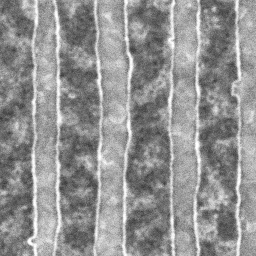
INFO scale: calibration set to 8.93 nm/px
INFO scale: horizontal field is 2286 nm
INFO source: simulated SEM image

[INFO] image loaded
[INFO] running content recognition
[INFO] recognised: one or a few lines or trenches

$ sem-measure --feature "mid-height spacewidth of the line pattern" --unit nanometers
218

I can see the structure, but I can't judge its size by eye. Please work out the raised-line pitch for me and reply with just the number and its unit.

614 nanometers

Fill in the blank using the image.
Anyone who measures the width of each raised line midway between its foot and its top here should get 372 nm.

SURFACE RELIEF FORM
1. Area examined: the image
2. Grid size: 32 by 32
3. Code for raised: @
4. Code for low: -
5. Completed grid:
@@@@@--@@@@@----@@@@@@---@@@@@--
@@@@@--@@@@@----@@@@@@---@@@@@--
@@@@@--@@@@@----@@@@@@---@@@@@--
@@@@---@@@@@----@@@@@@---@@@@@--
@@@@---@@@@@----@@@@@@---@@@@@--
@@@@---@@@@@----@@@@@@---@@@@@--
@@@@---@@@@@----@@@@@@---@@@@@--
@@@@---@@@@@----@@@@@@---@@@@@--
@@@@---@@@@@----@@@@@@---@@@@@--
@@@@---@@@@@@---@@@@@----@@@@@--
@@@@---@@@@@@---@@@@@@---@@@@---
@@@@---@@@@@@---@@@@@----@@@@---
@@@@---@@@@@@---@@@@@----@@@@@--
@@@@---@@@@@@---@@@@@----@@@@@--
@@@@---@@@@@@-@-@@@@@----@@@@@--
@@@@---@@@@@@---@@@@@----@@@@@--
@@@@---@@@@@@---@@@@@----@@@@@--
@@@@---@@@@@@---@@@@@----@@@@@--
@@@@---@@@@@@---@@@@@----@@@@@--
@@@@---@@@@@----@@@@@@---@@@@@--
@@@@---@@@@@----@@@@@----@@@@@--
@@@@---@@@@@----@@@@@@---@@@@@--
@@@@---@@@@@----@@@@@----@@@@@--
@@@@---@@@@@----@@@@@----@@@@@--
@@@@---@@@@@----@@@@@---@@@@@@--
@@@@---@@@@@----@@@@@---@@@@@@--
@@@@@--@@@@@----@@@@@---@@@@@@--
@@@@@--@@@@@----@@@@@@--@@@@@@--
@@@@@--@@@@@---@@@@@@@--@@@@@@--
@@@@---@@@@@----@@@@@@---@@@@@--
@@@@---@@@@@@--@@@@@@@@--@@@@@--
@@@@@--@@@@@----@@@@@@---@@@@@--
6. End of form